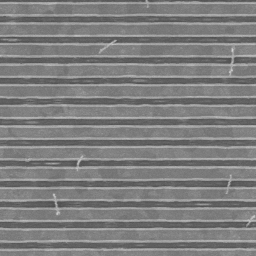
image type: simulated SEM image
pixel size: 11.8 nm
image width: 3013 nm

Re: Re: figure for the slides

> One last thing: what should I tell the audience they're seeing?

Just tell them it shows parallel lines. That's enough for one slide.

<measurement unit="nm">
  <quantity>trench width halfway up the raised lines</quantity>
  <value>91.2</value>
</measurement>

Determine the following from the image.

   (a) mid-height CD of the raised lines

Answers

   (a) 150 nm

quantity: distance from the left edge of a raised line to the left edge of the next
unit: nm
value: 242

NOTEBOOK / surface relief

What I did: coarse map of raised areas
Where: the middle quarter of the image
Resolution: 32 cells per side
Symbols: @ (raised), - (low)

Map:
@@@@@@@@@@@@@@@@@@@@@@@@@@@@@@@@
@@@@@@@@@@@@@@@@@@@@@@@@@@@@@@@@
@@@@@@@@@@@@@@@@@@@@@@@@@@@@@@@@
--------------------------------
--------------------------------
@@@@@@@@@@@@@@@@@@@@@@@@@@@@@@@@
@@@@@@@@@@@@@@@@@@@@@@@@@@@@@@@@
@@@@@@@@@@@@@@@@@@@@@@@@@@@@@@@@
--------------------------------
--------------------------------
@@@@@@@@@@@@@@@@@@@@@@@@@@@@@@@@
@@@@@@@@@@@@@@@@@@@@@@@@@@@@@@@@
@@@@@@@@@@@@@@@@@@@@@@@@@@@@@@@@
----------------------------@@--
--------------------------------
--------------------------------
@@@@@@@@@@@@@@@@@@@@@@@@@@@@@@@@
@@@@@@@@@@@@@@@@@@@@@@@@@@@@@@@@
@@@@@@@@@@@@@@@@@@@@-@@@@@@@@@@@
--------------------------------
--------------------------------
@@@@@@@@@@@@@@@@@@@@@@@@@@@@@@@@
@@@@@@@@@@@@@@@@@@@@@@@@@@@@@@@@
@@@@@@@@@@@@@@@@@@@@@@@@@@@@@@@@
--------------------------------
---@----------------------------
@@@@@@@@@@@@@@@@@@@@@@@@@@@@@@@@
@@@@@@@@@@@@@@@@@@@@@@@@@@@@@@@@
@@@@@@@@@@@@@@@@@@@@@@@@@@@@@@@@
--------------------------------
--------------------------------
@@@@@@@@@@@@@@@@@@@@@@@@@@@@@@@@